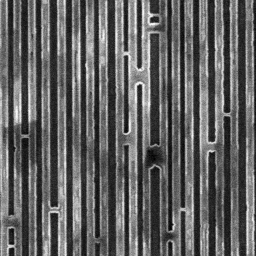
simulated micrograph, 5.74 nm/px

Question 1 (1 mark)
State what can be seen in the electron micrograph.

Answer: parallel lines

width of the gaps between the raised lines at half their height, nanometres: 35.9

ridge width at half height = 0.0445 um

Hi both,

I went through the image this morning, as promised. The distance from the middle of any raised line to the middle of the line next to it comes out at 83.3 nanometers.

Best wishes